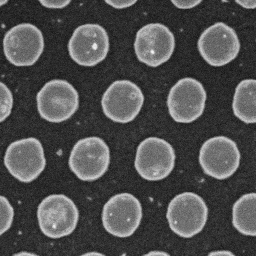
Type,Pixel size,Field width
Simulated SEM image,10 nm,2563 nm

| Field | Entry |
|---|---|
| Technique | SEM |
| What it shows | a regular array of raised bodies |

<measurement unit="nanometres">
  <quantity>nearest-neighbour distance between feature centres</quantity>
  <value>644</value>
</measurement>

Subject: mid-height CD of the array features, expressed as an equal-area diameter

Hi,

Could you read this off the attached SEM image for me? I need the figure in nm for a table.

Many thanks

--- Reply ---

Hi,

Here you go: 413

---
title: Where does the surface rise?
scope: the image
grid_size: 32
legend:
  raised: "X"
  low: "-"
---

-----XXX------XXX-----XXX-----XX
--------------------------------
--------------------------------
--XXX-----XXX-----XXX-----XXX---
-XXXX----XXXX----XXXXX---XXXXX--
XXXXX----XXXXX---XXXXX---XXXXX--
-XXXX----XXXX----XXXXX---XXXXX--
-XXXX----XXXX-----XXX-----XXX---
--------------------------------
--------------------------------
------XXX-----XXX-----XXX-----XX
X----XXXX----XXXXX---XXXXX---XXX
XX---XXXXX---XXXXX---XXXXX---XXX
X----XXXXX---XXXXX---XXXX----XXX
X----XXXX----XXXX----XXXX-----XX
--------------------------------
--------------------------------
---XX-----XXX-----XX------XXX---
-XXXX----XXXX----XXXXX---XXXXX--
-XXXX----XXXXX---XXXXX---XXXXX--
-XXXXX---XXXXX---XXXXX---XXXXX--
-XXXX----XXXX----XXXX-----XXX---
--XX---------------X------------
--------------------------------
------XX------XXX-----XXX------X
X----XXXX----XXXX----XXXXX---XXX
XX---XXXXX---XXXXX---XXXXX---XXX
XX---XXXXX---XXXXX---XXXXX---XXX
X----XXXX----XXXX----XXXX-----XX
------XX-------X-------X--------
--------------------------------
---------------------------XX---